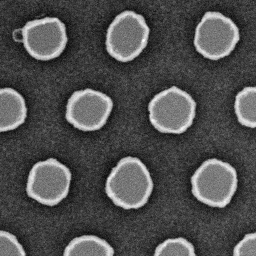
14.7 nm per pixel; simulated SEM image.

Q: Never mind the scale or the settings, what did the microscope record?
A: a regular array of raised bodies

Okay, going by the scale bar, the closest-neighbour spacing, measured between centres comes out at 1.21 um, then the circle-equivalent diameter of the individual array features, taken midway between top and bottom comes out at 629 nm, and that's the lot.